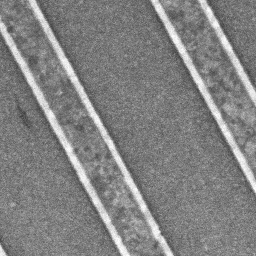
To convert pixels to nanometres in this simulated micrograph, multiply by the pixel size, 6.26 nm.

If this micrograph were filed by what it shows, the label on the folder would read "one or a few lines or trenches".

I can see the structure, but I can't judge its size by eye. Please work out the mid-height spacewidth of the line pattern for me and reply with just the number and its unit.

674 nm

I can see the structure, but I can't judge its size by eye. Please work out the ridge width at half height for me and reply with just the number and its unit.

250 nm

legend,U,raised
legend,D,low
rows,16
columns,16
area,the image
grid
UUDDDDDDDDUUUDDD
UUUDDDDDDDUUUDDD
DUUDDDDDDDDUUUDD
DUUUDDDDDDDDUUUD
DDUUDDDDDDDDUUUD
DDUUUDDDDDDDDUUU
DDDUUUDDDDDDDUUU
DDDUUUDDDDDDDDUU
DDDDUUUDDDDDDDUU
DDDDUUUDDDDDDDDU
DDDDDUUUDDDDDDDU
DDDDDUUUDDDDDDDD
DDDDDDUUUDDDDDDD
DDDDDDUUUDDDDDDD
DDDDDDDUUUDDDDDD
DDDDDDDDUUDDDDDD